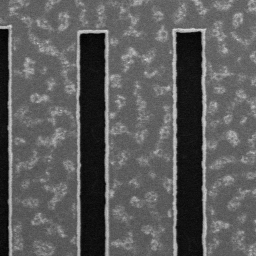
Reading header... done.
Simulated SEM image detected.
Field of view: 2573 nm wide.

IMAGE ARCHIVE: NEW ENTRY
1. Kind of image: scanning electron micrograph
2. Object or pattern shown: one or a few lines or trenches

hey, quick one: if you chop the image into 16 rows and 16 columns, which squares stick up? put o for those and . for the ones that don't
oooooooooooooooo
oooooooooooooooo
.oooo..oooo..ooo
.oooo..oooo..ooo
.oooo..oooo..ooo
.oooo..oooo..ooo
.oooo..oooo..ooo
.oooo..oooo..ooo
.oooo..oooo..ooo
.oooo..oooo..ooo
.oooo..oooo..ooo
.oooo..oooo..ooo
.oooo..oooo..ooo
.oooo..oooo..ooo
.oooo..oooo..ooo
.oooo..oooo..ooo